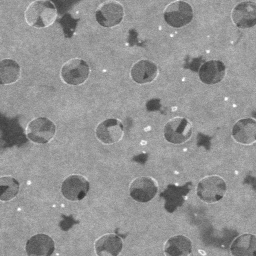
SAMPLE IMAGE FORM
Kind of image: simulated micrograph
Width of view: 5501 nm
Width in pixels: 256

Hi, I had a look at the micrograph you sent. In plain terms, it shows a regular array of raised bodies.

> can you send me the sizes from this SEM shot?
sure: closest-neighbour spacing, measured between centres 1440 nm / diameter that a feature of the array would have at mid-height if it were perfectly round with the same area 589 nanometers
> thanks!